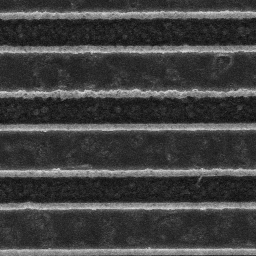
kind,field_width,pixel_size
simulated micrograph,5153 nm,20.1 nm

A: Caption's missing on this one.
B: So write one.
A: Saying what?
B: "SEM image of one or a few lines or trenches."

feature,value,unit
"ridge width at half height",45.9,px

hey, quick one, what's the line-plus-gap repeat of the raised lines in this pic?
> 1580 nm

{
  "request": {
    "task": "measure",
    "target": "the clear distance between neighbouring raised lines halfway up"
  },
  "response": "674 nanometers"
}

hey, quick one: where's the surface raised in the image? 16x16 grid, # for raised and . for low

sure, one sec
################
................
................
################
################
################
................
................
################
################
################
................
................
################
################
################